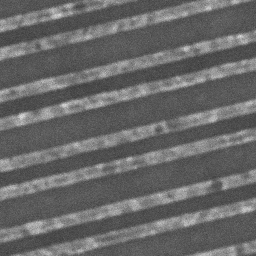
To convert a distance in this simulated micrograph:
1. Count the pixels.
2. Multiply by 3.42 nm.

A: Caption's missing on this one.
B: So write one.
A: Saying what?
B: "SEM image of parallel lines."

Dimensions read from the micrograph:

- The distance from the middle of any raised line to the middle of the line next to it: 116 nm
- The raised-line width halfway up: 0.0378 um